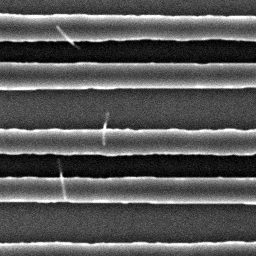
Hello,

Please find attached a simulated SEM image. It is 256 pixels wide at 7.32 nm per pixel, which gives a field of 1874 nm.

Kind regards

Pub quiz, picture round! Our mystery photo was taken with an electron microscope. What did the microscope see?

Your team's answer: lines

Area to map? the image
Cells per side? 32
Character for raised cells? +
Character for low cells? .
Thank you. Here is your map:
................................
................................
++++++++++++++++++++++++++++++++
++++++++++++++++++++++++++++++++
++++++++++++++++++++++++++++++++
................................
................................
................................
++++++++++++++++++++++++++++++++
++++++++++++++++++++++++++++++++
++++++++++++++++++++++++++++++++
................................
................................
................................
................................
................................
++++++++++++++++++++++++++++++++
++++++++++++++++++++++++++++++++
++++++++++++++++++++++++++++++++
................................
................................
................................
++++++++++++++++++++++++++++++++
++++++++++++++++++++++++++++++++
++++++++++++++++++++++++++++++++
................................
................................
................................
................................
................................
++++++++++++++++++++++++++++++++
++++++++++++++++++++++++++++++++